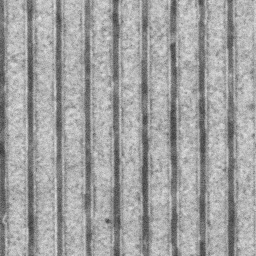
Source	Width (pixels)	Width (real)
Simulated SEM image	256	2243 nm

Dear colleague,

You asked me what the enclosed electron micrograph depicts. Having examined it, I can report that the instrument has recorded parallel lines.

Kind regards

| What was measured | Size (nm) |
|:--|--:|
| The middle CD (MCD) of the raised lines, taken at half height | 69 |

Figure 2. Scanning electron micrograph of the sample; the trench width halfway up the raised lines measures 183 nm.